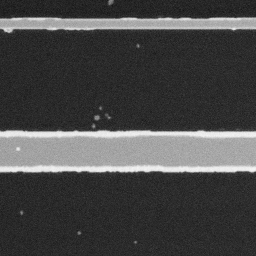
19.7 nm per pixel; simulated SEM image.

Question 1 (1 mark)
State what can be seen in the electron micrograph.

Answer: lines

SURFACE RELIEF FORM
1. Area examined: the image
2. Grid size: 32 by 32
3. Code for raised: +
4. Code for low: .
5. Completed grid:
................................
................................
++++++++++++++++++++++++++++++++
++++++++++++++++++++++++++++++++
................................
................................
................................
................................
................................
................................
................................
................................
................................
................................
................................
................................
................................
++++++++++++++++++++++++++++++++
++++++++++++++++++++++++++++++++
++++++++++++++++++++++++++++++++
++++++++++++++++++++++++++++++++
................................
................................
................................
................................
................................
................................
................................
................................
................................
................................
................................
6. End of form